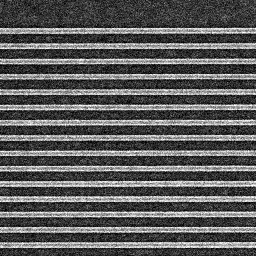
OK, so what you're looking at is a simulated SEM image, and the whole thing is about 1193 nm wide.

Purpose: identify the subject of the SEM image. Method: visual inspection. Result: parallel lines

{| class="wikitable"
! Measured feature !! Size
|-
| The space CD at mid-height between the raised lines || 51.3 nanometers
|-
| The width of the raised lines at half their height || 21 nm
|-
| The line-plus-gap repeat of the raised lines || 0.0713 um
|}